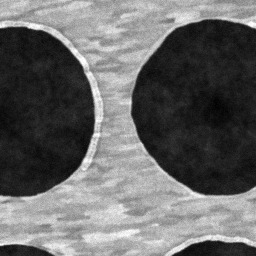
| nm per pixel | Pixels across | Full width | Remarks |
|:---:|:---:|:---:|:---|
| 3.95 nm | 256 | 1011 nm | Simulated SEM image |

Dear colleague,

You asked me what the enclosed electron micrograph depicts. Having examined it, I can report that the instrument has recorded holes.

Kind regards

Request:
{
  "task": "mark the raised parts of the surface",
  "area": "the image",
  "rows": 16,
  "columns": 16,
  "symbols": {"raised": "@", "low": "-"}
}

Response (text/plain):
@@@@@@@@@@@@@@@@
@@@@@@@@@@@@---@
----@@@@@@------
-----@@@@-------
-----@@@@-------
------@@--------
------@@--------
------@@--------
------@@@-------
-----@@@@-------
-----@@@@@------
----@@@@@@@-----
@@@@@@@@@@@@@@@@
@@@@@@@@@@@@@@@@
@@@@@@@@@@@@@@@@
--@@@@@@@@@@----